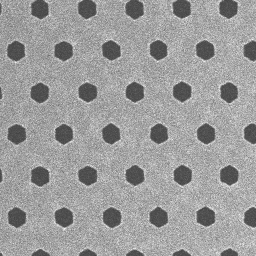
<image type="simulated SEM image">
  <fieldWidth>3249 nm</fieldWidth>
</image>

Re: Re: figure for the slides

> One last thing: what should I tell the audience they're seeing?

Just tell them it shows a regular array of holes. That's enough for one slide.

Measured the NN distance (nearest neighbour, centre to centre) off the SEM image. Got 595 nanometers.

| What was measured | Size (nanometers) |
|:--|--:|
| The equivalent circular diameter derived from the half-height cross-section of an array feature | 248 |